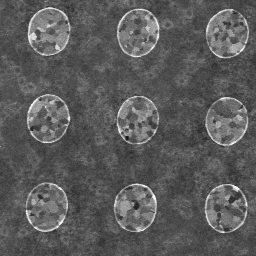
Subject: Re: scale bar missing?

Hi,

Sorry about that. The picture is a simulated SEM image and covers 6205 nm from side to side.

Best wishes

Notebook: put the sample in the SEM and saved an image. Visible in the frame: a regular array of raised bodies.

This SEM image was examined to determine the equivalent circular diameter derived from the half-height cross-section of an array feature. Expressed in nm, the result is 1080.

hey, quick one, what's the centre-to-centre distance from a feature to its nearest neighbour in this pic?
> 2120 nm